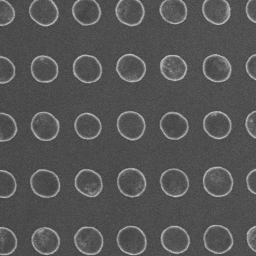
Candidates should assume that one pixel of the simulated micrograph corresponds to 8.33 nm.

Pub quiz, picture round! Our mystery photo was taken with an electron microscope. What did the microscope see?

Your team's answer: a regular array of raised bodies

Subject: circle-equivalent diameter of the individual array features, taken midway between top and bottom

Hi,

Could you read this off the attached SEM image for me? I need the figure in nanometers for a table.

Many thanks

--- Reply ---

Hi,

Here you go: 232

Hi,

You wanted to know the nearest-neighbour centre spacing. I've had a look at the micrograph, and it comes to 357 nanometres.